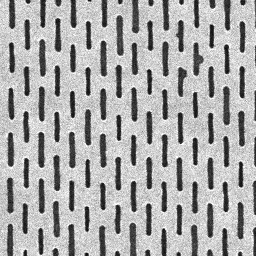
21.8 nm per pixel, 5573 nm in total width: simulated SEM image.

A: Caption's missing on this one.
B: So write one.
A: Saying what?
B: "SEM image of a regular array of holes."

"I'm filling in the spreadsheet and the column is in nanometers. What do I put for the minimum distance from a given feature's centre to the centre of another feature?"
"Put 590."